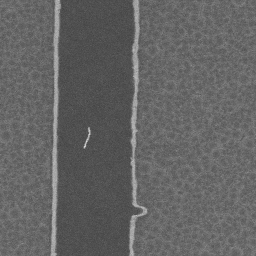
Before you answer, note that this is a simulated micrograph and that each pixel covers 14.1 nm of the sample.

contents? one or a few lines or trenches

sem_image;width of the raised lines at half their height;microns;1.13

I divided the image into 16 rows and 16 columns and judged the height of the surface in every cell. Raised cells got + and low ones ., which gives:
....+++++.......
....+++++.......
....+++++.......
....+++++.......
...+++++........
...+++++........
....++++........
...+++++........
...+++++........
...+++++........
...+++++........
...+++++........
...++++++.......
...++++++.......
...+++++........
...+++++........